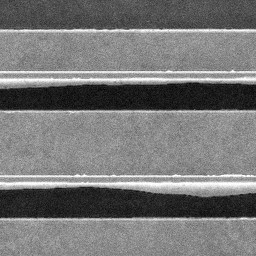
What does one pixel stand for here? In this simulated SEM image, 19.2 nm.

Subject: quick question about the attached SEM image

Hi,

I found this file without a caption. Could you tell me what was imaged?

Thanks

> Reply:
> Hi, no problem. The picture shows lines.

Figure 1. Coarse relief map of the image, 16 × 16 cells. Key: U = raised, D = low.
DDDDDDDDDDDDDDDD
DDDDDDDDDDDDDDDD
UUUUUUUUUUUUUUUU
UUUUUUUUUUUUUUUU
UUUUUUUUUUUUUUUU
DDDDDDDDDDDDDDDD
DDDDDDDDDDDDDDDD
UUUUUUUUUUUUUUUU
UUUUUUUUUUUUUUUU
UUUUUUUUUUUUUUUU
UUUUUUUUUUUUUUUU
UUUUUUUUUUUUUUUU
DDDDDDDDDDDDDDDD
DDDDDDDDDDDDDDDD
UUUUUUUUUUUUUUUU
UUUUUUUUUUUUUUUU